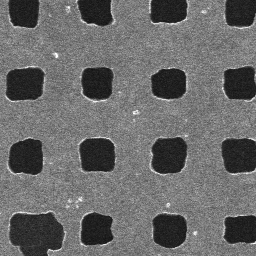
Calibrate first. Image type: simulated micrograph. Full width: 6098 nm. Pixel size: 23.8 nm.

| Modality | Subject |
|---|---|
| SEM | a regular array of holes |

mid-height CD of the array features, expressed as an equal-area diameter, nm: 853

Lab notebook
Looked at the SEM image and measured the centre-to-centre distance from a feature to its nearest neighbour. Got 1710 nm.